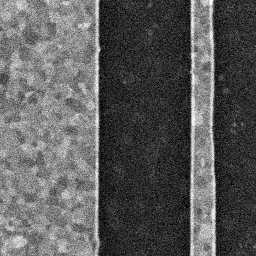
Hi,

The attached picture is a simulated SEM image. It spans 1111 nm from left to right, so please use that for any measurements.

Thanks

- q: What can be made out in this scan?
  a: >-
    one or a few lines or trenches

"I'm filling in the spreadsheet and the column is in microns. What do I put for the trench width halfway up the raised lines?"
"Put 0.414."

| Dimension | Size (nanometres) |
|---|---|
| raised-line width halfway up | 83.5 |